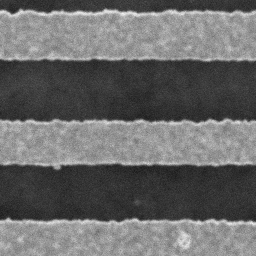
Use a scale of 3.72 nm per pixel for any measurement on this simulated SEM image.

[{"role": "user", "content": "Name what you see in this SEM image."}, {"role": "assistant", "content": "lines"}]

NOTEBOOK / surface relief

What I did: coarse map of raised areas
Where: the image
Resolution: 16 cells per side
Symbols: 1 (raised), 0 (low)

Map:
0000000000000000
1111111111111111
1111111111111111
1111111111111111
0000000000000000
0000000000000000
0000000000000000
0000000000000000
1111111111111111
1111111111111111
0000000000000000
0000000000000000
0000000000000000
0000000000000000
1111111111111111
1111111111111111